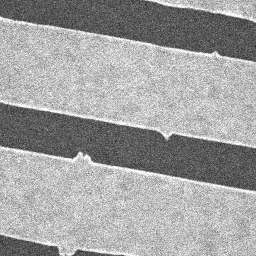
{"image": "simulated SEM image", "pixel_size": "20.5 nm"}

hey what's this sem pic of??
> one or a few lines or trenches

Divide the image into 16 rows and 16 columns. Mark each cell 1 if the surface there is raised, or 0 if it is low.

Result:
0000000000001111
1100000000000000
1111111100000000
1111111111111100
1111111111111111
1111111111111111
0111111111111111
0000001111111111
0000000000001111
1100000000000000
1111111000000000
1111111111111000
1111111111111111
1111111111111111
1111111111111111
0000111111111111